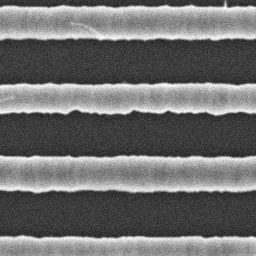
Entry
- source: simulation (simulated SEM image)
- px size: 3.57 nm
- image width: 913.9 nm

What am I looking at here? lines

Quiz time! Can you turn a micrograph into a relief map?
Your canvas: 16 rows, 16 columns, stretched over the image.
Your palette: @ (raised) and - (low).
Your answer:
@@@@@@@@@@@@@@@@
@@@@@@@@@@@@@@@@
----------------
----------------
----------------
@@@@@@@@@@@@@@@@
@@@@@@@@@@@@@@@@
----------------
----------------
----------------
@@@@@@@@@@@@@@@@
@@@@@@@@@@@@@@@@
----------------
----------------
----------------
@@@@@@@@@@@@@@@@